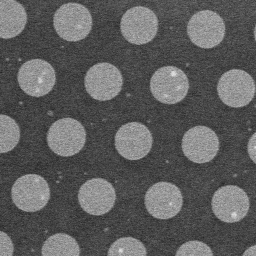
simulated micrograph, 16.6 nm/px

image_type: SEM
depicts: an array of small figures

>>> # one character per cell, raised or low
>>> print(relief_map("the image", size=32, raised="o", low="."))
oo......oo......................
ooo....oooo.....ooo......o......
ooo....oooo....ooooo....oooo....
ooo....oooo....ooooo...ooooo....
oo......ooo....oooo.....oooo....
.................o......ooo.....
................................
....o...........................
...oooo....ooo......oo..........
..ooooo....oooo....oooo.....ooo.
..ooooo....oooo....ooooo...ooooo
...ooo.....oooo....oooo....ooooo
............o.......ooo.....ooo.
................................
o...............................
oo.....ooo......oo..............
oo....ooooo....oooo....oooo.....
oo....ooooo...ooooo....oooo....o
oo....oooo.....oooo....oooo....o
...............ooo.....oooo....o
................................
................................
..oooo.....oo...................
..oooo....oooo.....ooo......oo..
.ooooo....oooo....ooooo....oooo.
..oooo....oooo....ooooo....oooo.
...........oo......ooo.....oooo.
............................oo..
................................
o.....ooo.......................
o.....oooo....oooo.....ooo......
oo...ooooo....oooo....oooo.....o